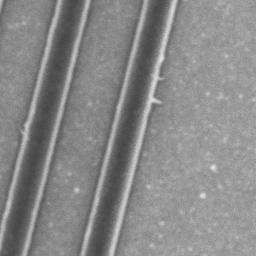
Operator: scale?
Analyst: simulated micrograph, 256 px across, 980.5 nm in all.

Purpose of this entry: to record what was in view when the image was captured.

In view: one or a few lines or trenches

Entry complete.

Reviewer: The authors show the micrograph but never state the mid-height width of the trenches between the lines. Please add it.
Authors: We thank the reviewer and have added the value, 209 nm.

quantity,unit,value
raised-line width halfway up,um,0.114